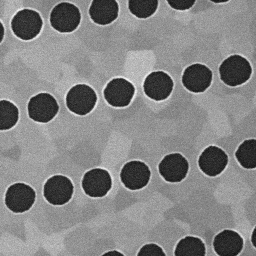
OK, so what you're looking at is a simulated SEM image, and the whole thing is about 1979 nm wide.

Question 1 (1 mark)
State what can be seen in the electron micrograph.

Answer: a regular array of holes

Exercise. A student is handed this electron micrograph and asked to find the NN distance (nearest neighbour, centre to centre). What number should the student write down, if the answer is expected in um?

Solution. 0.302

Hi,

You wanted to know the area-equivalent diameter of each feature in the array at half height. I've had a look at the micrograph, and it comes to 0.238 um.